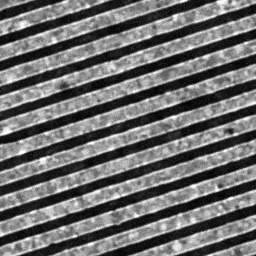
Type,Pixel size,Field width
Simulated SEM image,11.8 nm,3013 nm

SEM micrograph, parallel lines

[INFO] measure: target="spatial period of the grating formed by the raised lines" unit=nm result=281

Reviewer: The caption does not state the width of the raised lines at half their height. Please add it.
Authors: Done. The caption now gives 147 nanometers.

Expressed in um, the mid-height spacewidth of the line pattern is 0.127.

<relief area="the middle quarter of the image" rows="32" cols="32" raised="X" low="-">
--------XXXXXXXXXX----------XXXX
-----XXXXXXXXXXX---------XXXXXXX
--XXXXXXXXXXX---------XXXXXXXXXX
XXXXXXXXX---------XXXXXXXXXXX---
XXXXXX---------XXXXXXXXXX-------
XXX---------XXXXXXXXXX---------X
---------XXXXXXXXXX----------XXX
------XXXXXXXXXX---------XXXXXXX
---XXXXXXXXXX---------XXXXXXXXXX
XXXXXXXXXX---------XXXXXXXXXXX--
XXXXXXX---------XXXXXXXXXXX-----
XXXX---------XXXXXXXXXX---------
X---------XXXXXXXXXX---------XXX
-------XXXXXXXXXX---------XXXXXX
---XXXXXXXXXXX---------XXXXXXXXX
XXXXXXXXXXX----------XXXXXXXXX--
XXXXXXXX---------XXXXXXXXXX-----
XXXX----------XXXXXXXXXXX-------
X----------XXXXXXXXXX---------XX
-------XXXXXXXXXXX---------XXXXX
----XXXXXXXXXX----------XXXXXXXX
--XXXXXXXXX----------XXXXXXXXXX-
XXXXXXXXX---------XXXXXXXXXX----
XXXXXX---------XXXXXXXXXX-------
XX----------XXXXXXXXXX---------X
--------XXXXXXXXXXX---------XXXX
-----XXXXXXXXXXX--------XXXXXXXX
--XXXXXXXXXX----------XXXXXXXXXX
XXXXXXXXX----------XXXXXXXXXX---
XXXXXX----------XXXXXXXXXX------
XXX---------XXXXXXXXXXX---------
---------XXXXXXXXXX----------XXX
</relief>